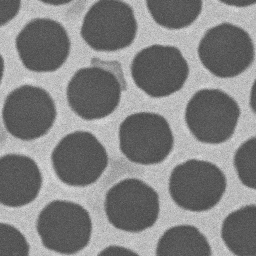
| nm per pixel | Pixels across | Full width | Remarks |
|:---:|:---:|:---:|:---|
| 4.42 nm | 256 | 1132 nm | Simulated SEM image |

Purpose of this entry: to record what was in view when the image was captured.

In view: a regular array of holes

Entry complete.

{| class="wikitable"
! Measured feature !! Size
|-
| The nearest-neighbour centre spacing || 300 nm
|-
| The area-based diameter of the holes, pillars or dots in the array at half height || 242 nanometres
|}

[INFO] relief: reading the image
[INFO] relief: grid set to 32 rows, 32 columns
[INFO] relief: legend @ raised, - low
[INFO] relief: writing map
---@@@--@@@@----@@-------@@@----
--@@@@@@@@@------@@------@@@@@@@
-@@@---@@@-------@@-----@@@@@@@@
@@@-----@@-------@@@@--@@@@---@@
@@------@@-------@@@@@@@@------@
@@-------@@-----@@@@@@@@@-------
@@-------@@@@@@@@------@@-------
@@@-----@@@@@@@@@------@@-------
@@@----@@@@--@@@--------@@-----@
@@@@@@@@@-----@@--------@@@---@@
@@@@@@@@@------@@------@@@@@@@@@
@-----@@-------@@@----@@@---@@@-
@------@-------@@@@@@@@@-----@@-
-------@@------@@@@@@@@-------@-
-------@@@---@@@----@@@-------@@
@------@@@@@@@@------@@-------@@
@-----@@@--@@@@------@@@-----@@@
@@@-@@@@----@@@-------@@@---@@@-
@@@@@@@------@@------@@@@@@@@@--
---@@@-------@@@-----@@@@@@@@---
----@@@------@@@@--@@@@----@@---
-----@@------@@@@@@@@@------@@--
-----@@@----@@@---@@@-------@@--
-----@@@@@@@@@-----@@-------@@@-
-----@@@@@@@@-------@-------@@@@
---@@@----@@@-------@@-----@@@@@
@@@@@------@@-------@@@@@@@@@---
@@@@@------@@@------@@@@@@@@----
--@@@-------@@@---@@@----@@@----
---@@------@@@@@@@@@-----@@@----
----@------@@@@@@@@@------@@----
----@@@---@@@----@@-------@@@---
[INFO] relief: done